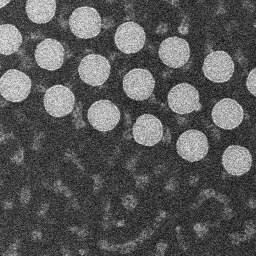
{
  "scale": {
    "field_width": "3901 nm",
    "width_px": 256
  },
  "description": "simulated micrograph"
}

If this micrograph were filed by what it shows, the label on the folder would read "a regular array of holes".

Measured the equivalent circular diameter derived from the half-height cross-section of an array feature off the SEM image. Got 454 nanometres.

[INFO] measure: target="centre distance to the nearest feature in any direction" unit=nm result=712